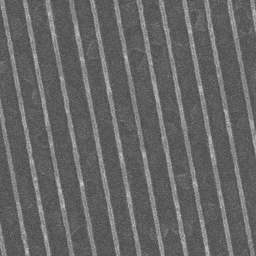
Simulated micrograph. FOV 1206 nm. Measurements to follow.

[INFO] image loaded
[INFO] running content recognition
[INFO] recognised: parallel lines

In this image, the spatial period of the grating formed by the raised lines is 22.2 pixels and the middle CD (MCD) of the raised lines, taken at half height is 16.7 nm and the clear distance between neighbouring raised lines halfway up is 88.5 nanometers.